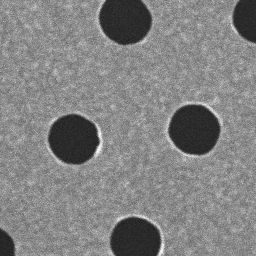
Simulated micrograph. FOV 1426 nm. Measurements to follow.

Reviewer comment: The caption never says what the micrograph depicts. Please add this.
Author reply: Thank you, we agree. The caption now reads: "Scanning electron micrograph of holes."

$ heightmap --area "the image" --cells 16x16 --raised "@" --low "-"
@@@@@@---@@@@@@-
@@@@@@---@@@@@@-
@@@@@@@--@@@@@@-
@@@@@@@@@@@@@@@@
@@@@@@@@@@@@@@@@
@@@@@@@@@@@@@@@@
@@@@@@@@@@@@@@@@
@@@@-@@@@@@---@@
@@@---@@@@@---@@
@@@---@@@@@--@@@
@@@@@@@@@@@@@@@@
@@@@@@@@@@@@@@@@
@@@@@@@@@@@@@@@@
@@@@@@@@@@@@@@@@
@@@@@@@---@@@@@@
-@@@@@@---@@@@@@